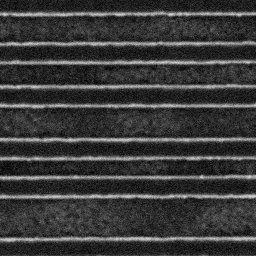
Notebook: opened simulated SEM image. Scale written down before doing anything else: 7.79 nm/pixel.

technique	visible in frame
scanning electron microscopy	lines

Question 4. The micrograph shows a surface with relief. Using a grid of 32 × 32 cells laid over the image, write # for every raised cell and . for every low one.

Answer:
################################
################################
................................
................................
................................
.###############################
################################
################################
................................
................................
................................
################################
################################
................................
................................
................................
................................
################################
################################
################################
................................
................................
################################
################################
################################
................................
................................
................................
................................
................................
################################
################################